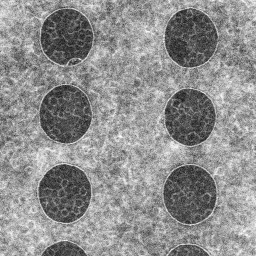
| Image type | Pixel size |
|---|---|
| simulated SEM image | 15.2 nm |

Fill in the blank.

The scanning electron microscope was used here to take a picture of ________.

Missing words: raised bodies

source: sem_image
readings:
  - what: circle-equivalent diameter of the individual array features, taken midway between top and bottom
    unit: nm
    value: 862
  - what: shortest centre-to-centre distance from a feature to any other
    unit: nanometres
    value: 1170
